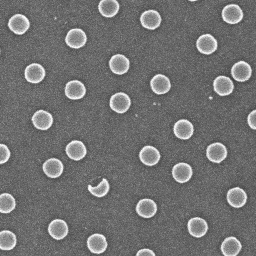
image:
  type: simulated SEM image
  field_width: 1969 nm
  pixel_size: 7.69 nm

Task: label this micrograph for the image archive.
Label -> a regular array of raised bodies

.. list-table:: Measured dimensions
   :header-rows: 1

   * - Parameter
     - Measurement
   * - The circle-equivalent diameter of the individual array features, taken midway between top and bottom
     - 148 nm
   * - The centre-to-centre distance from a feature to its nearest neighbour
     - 318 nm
